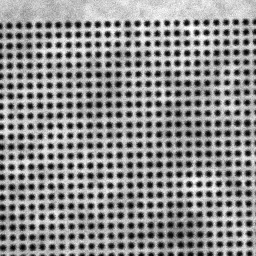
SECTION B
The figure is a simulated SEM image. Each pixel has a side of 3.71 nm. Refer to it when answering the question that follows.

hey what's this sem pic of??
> a regular array of holes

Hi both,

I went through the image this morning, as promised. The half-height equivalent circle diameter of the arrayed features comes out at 26.5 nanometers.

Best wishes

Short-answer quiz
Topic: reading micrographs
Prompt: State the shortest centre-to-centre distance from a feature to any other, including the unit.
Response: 36.3 nanometres